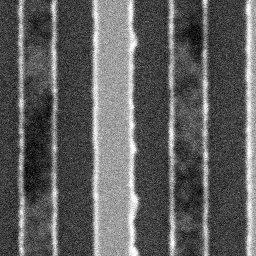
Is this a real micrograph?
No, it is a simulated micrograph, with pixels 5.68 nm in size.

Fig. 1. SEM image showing lines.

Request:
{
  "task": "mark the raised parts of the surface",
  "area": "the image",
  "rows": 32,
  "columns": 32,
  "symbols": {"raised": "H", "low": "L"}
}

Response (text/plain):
LLLHHHHLLLLLHHHHLLLLLHHHHHLLLLLH
LLHHHHHLLLLLHHHHLLLLLHHHHHLLLLLH
LLLHHHHLLLLLHHHHLLLLLHHHHHLLLLLH
LLHHHHHLLLLLHHHHLLLLLHHHHHLLLLLH
LLLHHHHLLLLLHHHHHLLLLHHHHHLLLLLH
LLHHHHHLLLLLHHHHHLLLLHHHHHLLLLLH
LLLHHHHLLLLLHHHHLLLLLHHHHHLLLLLH
LLLHHHHLLLLLHHHHLLLLLHHHHHLLLLLH
LLLHHHHLLLLLHHHHHLLLLHHHHHLLLLLH
LLLHHHHLLLLLHHHHLLLLLHHHHHLLLLLH
LLLHHHHLLLLLHHHHLLLLLHHHHHLLLLLH
LLLHHHHLLLLLHHHHLLLLLHHHHHLLLLLH
LLLHHHHLLLLLHHHHLLLLLHHHHHLLLLLH
LLLHHHHLLLLLHHHHHLLLLHHHHHLLLLLH
LLLHHHHLLLLLHHHHLLLLLHHHHHLLLLLH
LLLHHHHLLLLLHHHHHLLLLHHHHHLLLLLH
LLLHHHHLLLLLHHHHLLLLLHHHHHLLLLLH
LLLHHHHLLLLLHHHHHLLLLHHHHHLLLLLH
LLLHHHHLLLLLHHHHHLLLLHHHHHLLLLLH
LLLHHHHLLLLLHHHHHLLLLHHHHHLLLLLH
LLLHHHHLLLLLHHHHHLLLLHHHHHLLLLLH
LLLHHHHLLLLLHHHHHLLLLHHHHHLLLLLH
LLLHHHHLLLLLHHHHHLLLLHHHHHLLLLLH
LLLHHHHLLLLLHHHHHLLLLHHHHHLLLLLH
LLLHHHHLLLLLHHHHHLLLLHHHHHLLLLLH
LLLHHHHLLLLLHHHHHLLLLHHHHHLLLLLH
LLLHHHHLLLLLHHHHHLLLLHHHHHLLLLLH
LLLHHHHLLLLLHHHHLLLLLHHHHHLLLLLH
LLLHHHHLLLLLHHHHHLLLLHHHHHLLLLLH
LLLHHHHLLLLLHHHHHLLLLHHHHHLLLLLH
LLLHHHHLLLLLHHHHHLLLLHHHHHLLLLLH
LLLHHHHLLLLLHHHHHLLLLHHHHHLLLLLH